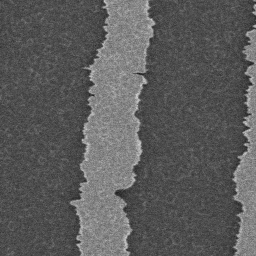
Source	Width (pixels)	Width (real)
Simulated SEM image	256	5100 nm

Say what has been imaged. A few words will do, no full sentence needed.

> one or a few lines or trenches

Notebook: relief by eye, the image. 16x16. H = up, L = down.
LLLLLLLHHLLLLLLL
LLLLLLLHHLLLLLLL
LLLLLLLHHLLLLLLL
LLLLLLHHHLLLLLLH
LLLLLLHHHLLLLLLL
LLLLLLHHHLLLLLLL
LLLLLLHHHLLLLLLH
LLLLLLHHHLLLLLLH
LLLLLHHHHLLLLLLH
LLLLLHHHHLLLLLLH
LLLLLHHHLLLLLLLH
LLLLLHHHLLLLLLLH
LLLLLHHHLLLLLLLH
LLLLLHHHLLLLLLLH
LLLLLHHHLLLLLLLH
LLLLLHHHLLLLLLLH